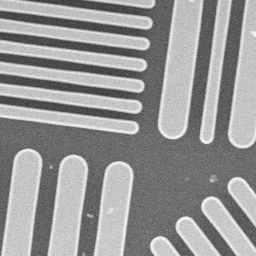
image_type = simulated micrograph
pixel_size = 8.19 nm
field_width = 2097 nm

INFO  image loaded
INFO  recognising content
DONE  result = groups of lines, slits or small figures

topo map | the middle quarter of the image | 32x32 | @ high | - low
----------@@@@@@@@@@------@@@@@@
------------------@@-----@@@@@@@
@@@@@@@------------------@@@@@@@
@@@@@@@@@@@@@@@----------@@@@@@@
-@@@@@@@@@@@@@@@@@@------@@@@@@@
-------@@@@@@@@@@@@@-----@@@@@@@
----------------@@@------@@@@@@@
@@@@@--------------------@@@@@@@
@@@@@@@@@@@@-------------@@@@@@@
@@@@@@@@@@@@@@@@@@------@@@@@@@-
-----@@@@@@@@@@@@@@-----@@@@@@@-
-------------@@@@@@-----@@@@@@@-
@@----------------------@@@@@@@-
@@@@@@@@@@--------------@@@@@@@-
@@@@@@@@@@@@@@@@@-------@@@@@@@-
---@@@@@@@@@@@@@@@------@@@@@@@-
-----------@@@@@@@------@@@@@@--
-------------------------@@@@@--
--------------------------------
--------------------------------
--------------------------------
--------------------------------
--------------------------------
@@@@----------------------------
@@@@@---------------------------
@@@@@@-----@@@@@----------------
@@@@@@-----@@@@@@---------------
@@@@@@----@@@@@@@---------------
@@@@@@----@@@@@@@---------------
@@@@@-----@@@@@@@---------------
@@@@@-----@@@@@@@---------------
@@@@@-----@@@@@@@---------------